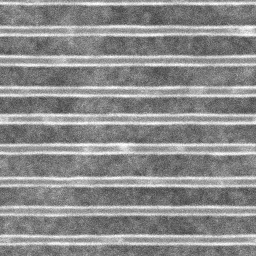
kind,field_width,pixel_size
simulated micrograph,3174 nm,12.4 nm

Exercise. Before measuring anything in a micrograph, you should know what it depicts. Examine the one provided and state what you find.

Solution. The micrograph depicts parallel lines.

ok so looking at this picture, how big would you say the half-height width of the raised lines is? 99.2 nm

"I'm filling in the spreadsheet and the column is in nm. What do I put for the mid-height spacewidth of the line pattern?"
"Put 267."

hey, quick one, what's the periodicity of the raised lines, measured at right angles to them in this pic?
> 370 nm